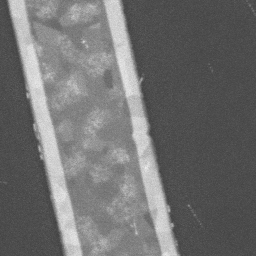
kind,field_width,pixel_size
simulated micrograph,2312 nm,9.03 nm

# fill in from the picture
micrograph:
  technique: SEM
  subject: one or a few lines or trenches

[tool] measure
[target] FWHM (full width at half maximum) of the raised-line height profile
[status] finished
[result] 831 nanometers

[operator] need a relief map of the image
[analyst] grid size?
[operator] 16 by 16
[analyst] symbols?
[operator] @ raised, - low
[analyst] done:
-@@@@@@---------
-@@@@@@---------
--@@@@@@--------
--@@@@@@--------
--@@@@@@--------
--@@@@@@--------
---@@@@@--------
---@@@@@@-------
---@@@@@@-------
---@@@@@@-------
---@@@@@@-------
----@@@@@-------
----@@@@@@------
----@@@@@@------
----@@@@@@------
-----@@@@@------